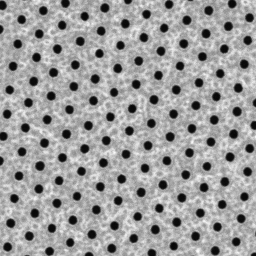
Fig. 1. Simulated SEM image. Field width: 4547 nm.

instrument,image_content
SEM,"a regular array of holes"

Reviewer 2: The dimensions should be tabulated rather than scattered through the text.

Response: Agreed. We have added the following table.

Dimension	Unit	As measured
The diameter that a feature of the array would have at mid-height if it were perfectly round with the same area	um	0.169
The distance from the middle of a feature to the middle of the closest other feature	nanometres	402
